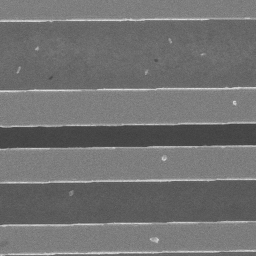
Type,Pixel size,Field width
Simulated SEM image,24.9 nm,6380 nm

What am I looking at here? lines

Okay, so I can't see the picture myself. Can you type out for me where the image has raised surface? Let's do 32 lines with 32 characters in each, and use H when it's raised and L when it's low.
HHHHHHHHHHHHHHHHHHHHHHHHHHHHHHHH
HHHHHHHHHHHHHHHHHHHHHHHHHHHHHHHH
HHHHHHHHHHHHHHHHHHLLLLLLLLLLLLLL
LLLLLLLLLLLLLLLLLLLLLLLLLLLLLLLL
LLLLLLLLLLLLLLLLLLLLLLLLLLLLLLLL
LLLLLLLLLLLLLLLLLLLLLLLLLLLLLLLL
LLLLLLLLLLLLLLLLLLLLLLLLLLLLLLLL
LLLLLLLLLLLLLLLLLLLLLLLLLLLLLLLL
LLLLLLLLLLLLLLLLLLLLLLLLLLLLLLLL
LLLLLLLLLLLLLLLLLLLLLLLLLLLLLLLL
LLLLLLLLLLLLLLLLLLLLLLLLLLLLLLLL
HHHHHHHHHHHHHHHHHHHHHHHHHHHHHHHH
HHHHHHHHHHHHHHHHHHHHHHHHHHHHHHHH
HHHHHHHHHHHHHHHHHHHHHHHHHHHHHHHH
HHHHHHHHHHHHHHHHHHHHHHHHHHHHHHHH
HHHHHHHHHHHHHHHHHHHHHHHLLLLLLLLL
LLLLLLLLLLLLLLLLLLLLLLLLLLLLLLLL
LLLLLLLLLLLLLLLLLLLLLLLLLLLLLLLL
LLLLLLLLLHHHHHHHHHHHHHHHHHHHHHHH
HHHHHHHHHHHHHHHHHHHHHHHHHHHHHHHH
HHHHHHHHHHHHHHHHHHHHHHHHHHHHHHHH
HHHHHHHHHHHHHHHHHHHHHHHHHHHHHHHH
HHHHHHHHHHHHHHHHHHHHHHHHHHHLLLLL
LLLLLLLLLLLLLLLLLLLLLLLLLLLLLLLL
LLLLLLLLLLLLLLLLLLLLLLLLLLLLLLLL
LLLLLLLLLLLLLLLLLLLLLLLLLLLLLLLL
LLLLLLLLLLLLLLLLLLLLLLLLLLLLLLLL
LLLLLLLLLLLLLLLLLLLLLLLLLLLLLLLL
HHHHHHHHHHHHHHHHHHHHHHHHHHHHHHHH
HHHHHHHHHHHHHHHHHHHHHHHHHHHHHHHH
HHHHHHHHHHHHHHHHHHHHHHHHHHHHHHHH
HHHHHHHHHHHHHHHHHHHHLLLLLLLLLLLL